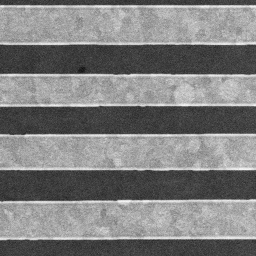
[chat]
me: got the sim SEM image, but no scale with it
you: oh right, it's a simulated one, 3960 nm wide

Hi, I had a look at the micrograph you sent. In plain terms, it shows lines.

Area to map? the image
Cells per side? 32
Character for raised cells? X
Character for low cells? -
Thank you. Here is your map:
--------------------------------
XXXXXXXXXXXXXXXXXXXXXXXXXXXXXXXX
XXXXXXXXXXXXXXXXXXXXXXXXXXXXXXXX
XXXXXXXXXXXXXXXXXXXXXXXXXXXXXXXX
XXXXXXXXXXXXXXXXXXXXXXXXXXXXXXXX
--------------------------------
--------------------------------
--------------------------------
--------------------------------
XXXXXXXXXXXXXXXXXXXXXXXXXXXXXXXX
XXXXXXXXXXXXXXXXXXXXXXXXXXXXXXXX
XXXXXXXXXXXXXXXXXXXXXXXXXXXXXXXX
XXXXXXXXXXXXXXXXXXXXXXXXXXXXXXXX
--------------------------------
--------------------------------
--------------------------------
--------------------------------
XXXXXXXXXXXXXXXXXXXXXXXXXXXXXXXX
XXXXXXXXXXXXXXXXXXXXXXXXXXXXXXXX
XXXXXXXXXXXXXXXXXXXXXXXXXXXXXXXX
XXXXXXXXXXXXXXXXXXXXXXXXXXXXXXXX
--------------------------------
--------------------------------
--------------------------------
--------------------------------
XXXXXXXXXXXXXXXXXXXXXXXXXXXXXXXX
XXXXXXXXXXXXXXXXXXXXXXXXXXXXXXXX
XXXXXXXXXXXXXXXXXXXXXXXXXXXXXXXX
XXXXXXXXXXXXXXXXXXXXXXXXXXXXXXXX
XXXXXXXXXXXXXXXXXXXXXXXXXXXXXXXX
--------------------------------
--------------------------------